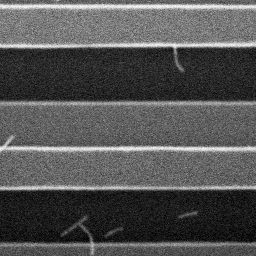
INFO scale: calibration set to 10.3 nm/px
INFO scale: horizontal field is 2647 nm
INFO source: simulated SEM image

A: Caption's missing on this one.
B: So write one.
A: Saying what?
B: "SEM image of lines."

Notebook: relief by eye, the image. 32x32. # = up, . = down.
################################
################################
################################
################################
################################
################################
................................
................................
................................
................................
................................
................................
................................
################################
################################
################################
################################
################################
################################
################################
################################
################################
################################
################################
................................
................................
................................
................................
................................
................................
................................
################################